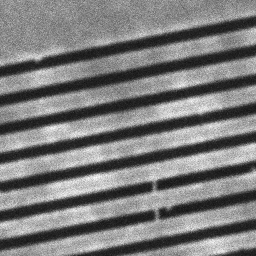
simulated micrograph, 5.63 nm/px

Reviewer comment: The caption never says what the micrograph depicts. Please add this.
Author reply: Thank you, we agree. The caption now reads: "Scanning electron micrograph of parallel lines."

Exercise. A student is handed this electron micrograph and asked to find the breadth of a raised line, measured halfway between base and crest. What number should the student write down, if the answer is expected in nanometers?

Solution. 95.3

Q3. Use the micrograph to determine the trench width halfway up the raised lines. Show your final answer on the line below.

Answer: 66.9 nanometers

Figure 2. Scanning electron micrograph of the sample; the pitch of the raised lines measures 160 nm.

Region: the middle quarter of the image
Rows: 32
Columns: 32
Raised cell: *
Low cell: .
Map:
*********************...........
****************..............**
**********...............*******
*****...............************
...............*****************
..........*********************.
.....*********************......
*********************...........
****************................
***********................*****
******................**********
*................***************
............********************
.......********************.....
..*********************.........
******************..............
*************...............****
********..............**********
***..............***************
............********************
.......**********************...
..**********************........
******************..............
*************................***
********................********
***................*************
..............******************
.........*********************..
....*********************.......
********************..*.........
***************...............**
**********...............*******